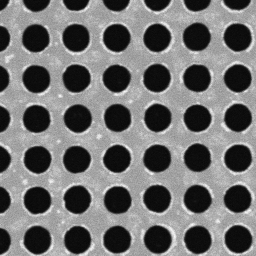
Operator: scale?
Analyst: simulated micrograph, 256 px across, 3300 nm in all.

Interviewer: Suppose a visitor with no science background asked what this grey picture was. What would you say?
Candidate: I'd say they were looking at a regular array of holes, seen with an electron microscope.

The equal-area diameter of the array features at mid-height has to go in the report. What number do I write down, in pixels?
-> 27.5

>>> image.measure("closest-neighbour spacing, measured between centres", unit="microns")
0.514